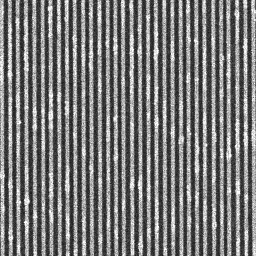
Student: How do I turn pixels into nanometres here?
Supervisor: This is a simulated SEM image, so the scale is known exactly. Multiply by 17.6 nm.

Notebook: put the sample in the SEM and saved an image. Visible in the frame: parallel lines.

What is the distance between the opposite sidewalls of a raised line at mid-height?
61.6 nm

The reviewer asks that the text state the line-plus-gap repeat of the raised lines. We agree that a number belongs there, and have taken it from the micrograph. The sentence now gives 143 nm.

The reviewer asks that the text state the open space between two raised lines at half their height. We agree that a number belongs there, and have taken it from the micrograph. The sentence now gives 79.3 nm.